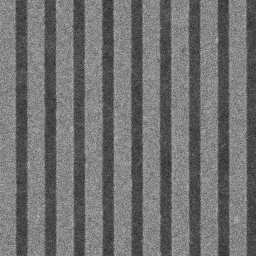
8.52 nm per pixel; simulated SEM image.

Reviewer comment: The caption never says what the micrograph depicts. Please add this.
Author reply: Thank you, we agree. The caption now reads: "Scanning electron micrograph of parallel lines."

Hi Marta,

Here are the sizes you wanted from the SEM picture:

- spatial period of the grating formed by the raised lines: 246 nm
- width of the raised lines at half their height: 0.141 micrometres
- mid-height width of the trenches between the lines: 106 nm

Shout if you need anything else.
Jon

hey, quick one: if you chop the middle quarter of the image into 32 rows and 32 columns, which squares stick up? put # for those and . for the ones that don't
##...####....####...####...####.
##...####....####...####...####.
##...####....####...####...####.
##...####....####...####...####.
##...####....####...####...####.
##...####....####...####...####.
##...####....####...####...####.
##...####....####...####...####.
##...####....####...####...####.
##...####....####...####...#####
##...####....####...####...####.
##...####....####...####...####.
##...####....####...####...####.
##...####....####...####...####.
##...####....####...####...####.
##...####....####...####...####.
##...####....####...####...####.
##...####....####...####...####.
##...####....####...####...####.
##...####....####...####...####.
##...####.#..####...#####..####.
##...####....####...####...####.
##...####....####...####...####.
##....###....####...####...####.
##....###....####...####...####.
##...####....####...####...####.
##...####....####...####...####.
##...####....####...####...####.
##...####....####...####...####.
##...####....####...####...####.
##...####....####...####...####.
##...####....####...####...####.